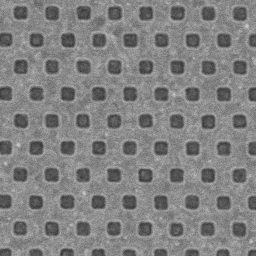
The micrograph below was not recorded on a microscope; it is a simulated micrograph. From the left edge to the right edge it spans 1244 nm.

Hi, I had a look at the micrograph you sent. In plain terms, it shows a regular array of holes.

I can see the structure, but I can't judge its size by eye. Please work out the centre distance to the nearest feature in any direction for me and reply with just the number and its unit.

0.15 microns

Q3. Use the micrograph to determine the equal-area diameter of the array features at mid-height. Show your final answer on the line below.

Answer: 0.0759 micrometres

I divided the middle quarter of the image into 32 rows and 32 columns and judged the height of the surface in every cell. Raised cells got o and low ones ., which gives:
ooo....oooo....oooo...oooo....oo
ooo....oooo....oooo...oooo....oo
oooo..ooooo...ooooo...ooooo...oo
oooooooooooooooooooooooooooooooo
oooooooooooooooooooooooooooooooo
.ooooooooooooooooooooooooooooooo
...oooo...ooooo...ooooo...oooo..
...oooo....oooo...oooo....oooo..
...oooo....oooo...oooo....oooo..
o.oooooooooooooooooooooooooooooo
oooooooooooooooooooooooooooooooo
oooooooooooooooooooooooooooooooo
oooo..oooooo.oooooo..oooooo..ooo
ooo...ooooo....oooo...oooo....oo
ooo...ooooo....oooo...oooo....oo
ooo...ooooo...ooooo...oooo....oo
oooooooooooooooooooooooooooooooo
oooooooooooooooooooooooooooooooo
oooooooooooooooooooooooooooooooo
...oooo...ooooo...ooooo...ooooo.
...oooo....ooo....oooo....oooo..
...oooo....ooo....oooo....oooo..
..ooooo...ooooo...ooooo...oooo..
oooooooooooooooooooooooooooooooo
oooooooooooooooooooooooooooooooo
oooooooooooooooooooooooooooooooo
ooo...ooooo...ooooo...ooooo...oo
ooo....oooo...oooo....oooo....oo
ooo....oooo...oooo....oooo....oo
oooo..ooooo...ooooo...ooooo...oo
oooooooooooooooooooooooooooooooo
oooooooooooooooooooooooooooooooo